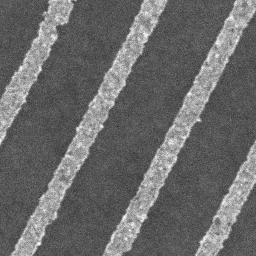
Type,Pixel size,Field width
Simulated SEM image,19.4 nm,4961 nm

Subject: one or a few lines or trenches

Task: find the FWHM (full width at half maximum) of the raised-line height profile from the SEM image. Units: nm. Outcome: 349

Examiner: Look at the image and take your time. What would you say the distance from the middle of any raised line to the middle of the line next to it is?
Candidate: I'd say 1570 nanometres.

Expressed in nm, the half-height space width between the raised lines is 1220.